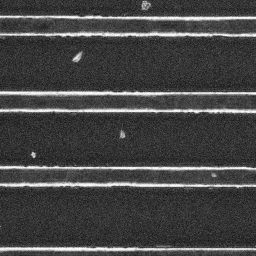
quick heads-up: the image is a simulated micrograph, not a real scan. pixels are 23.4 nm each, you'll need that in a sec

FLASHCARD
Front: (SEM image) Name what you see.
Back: lines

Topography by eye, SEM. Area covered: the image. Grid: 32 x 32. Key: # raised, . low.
................................
................................
################################
################################
................................
................................
................................
................................
................................
................................
................................
................................
################################
################################
................................
................................
................................
................................
................................
................................
................................
################################
################################
................................
................................
................................
................................
................................
................................
................................
................................
################################